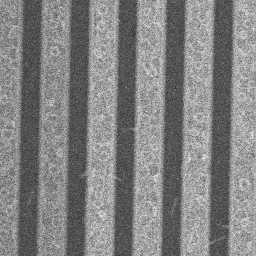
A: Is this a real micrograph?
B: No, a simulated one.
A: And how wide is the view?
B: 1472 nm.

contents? parallel lines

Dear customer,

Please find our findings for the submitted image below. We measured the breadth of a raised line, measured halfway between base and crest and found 0.147 um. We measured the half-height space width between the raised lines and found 130 nm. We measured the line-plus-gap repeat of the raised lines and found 275 nm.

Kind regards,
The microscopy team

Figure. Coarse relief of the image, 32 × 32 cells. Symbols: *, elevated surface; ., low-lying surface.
***...***...***..****..****..***
***...***...***..****..****..***
***..****...***..***...****..***
***..****..****..***...***...***
***..****..****..***...***...***
**...****..****..***...***...***
**...***...****..***...***...***
**...***...***...***...***...***
**...***...***...***...***...***
**...***...***...***...***...***
**...***...***...***...***...***
**...***...***...***...***...***
**...***...***...***...***...***
**...***...***...***...***...***
**...***...***...***...***...***
**...***...***...***...***...***
**...***...***...***...***...***
**...***...***...***...***...***
**...***...***...***...***...***
**...***...***...***...***...***
**...***...***...***...***...***
**...***...***...***...***...***
**...***...***...***...***...***
**...***...***...***...***...***
**...***...***...***...***...***
**...***...***...***...***...***
**...***...***...***...***...***
**...***...***...***...***...***
**...***...***...***...***...***
**...***...***...***...***...***
**...***...***...***...***...***
**...***...***...***...***...***